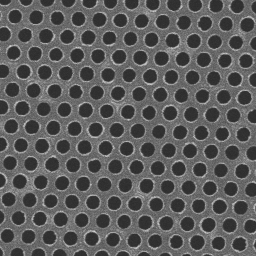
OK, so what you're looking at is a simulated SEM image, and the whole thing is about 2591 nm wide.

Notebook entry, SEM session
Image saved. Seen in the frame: a regular array of holes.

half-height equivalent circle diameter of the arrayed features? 141 nanometres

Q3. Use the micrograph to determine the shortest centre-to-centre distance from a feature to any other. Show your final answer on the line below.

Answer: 20.9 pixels